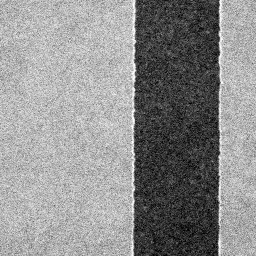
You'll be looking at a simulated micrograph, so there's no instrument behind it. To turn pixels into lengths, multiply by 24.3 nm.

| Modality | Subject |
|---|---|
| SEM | one or a few lines or trenches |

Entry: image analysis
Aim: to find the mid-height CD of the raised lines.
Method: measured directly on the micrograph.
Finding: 2120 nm